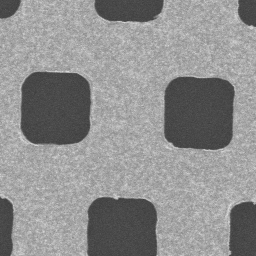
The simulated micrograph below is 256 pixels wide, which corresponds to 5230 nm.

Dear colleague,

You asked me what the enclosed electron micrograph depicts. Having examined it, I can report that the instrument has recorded holes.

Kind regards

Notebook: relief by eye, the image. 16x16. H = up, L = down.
LHHHHHLLLLHHHHHL
HHHHHHHHHHHHHHHL
HHHHHHHHHHHHHHHH
HHHHHHHHHHHHHHHH
HHHHHHHHHHHHHHHH
HLLLLLHHHHLLLLLH
HLLLLLHHHHLLLLLH
HLLLLLHHHHLLLLLH
HHLLLHHHHHLLLLLH
HHHHHHHHHHHHHHHH
HHHHHHHHHHHHHHHH
HHHHHHHHHHHHHHHH
HHHHHHLLLHHHHHHH
LHHHHLLLLLHHHHLL
LHHHHLLLLLHHHHLL
LHHHHLLLLLHHHHLL